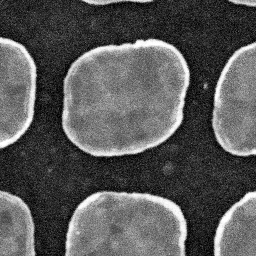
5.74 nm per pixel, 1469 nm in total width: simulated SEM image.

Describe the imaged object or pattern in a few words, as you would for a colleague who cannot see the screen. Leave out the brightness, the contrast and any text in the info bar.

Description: raised bodies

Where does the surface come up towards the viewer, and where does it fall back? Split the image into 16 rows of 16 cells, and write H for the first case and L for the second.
LLLLLLLLLLLLLLLL
LLLLLLLLLLLLLLLL
LLLLLLLLLHLLLLLL
HHLLLHHHHHHLLLLH
HHLLHHHHHHHHLLHH
HHLLHHHHHHHHLLHH
HHLLHHHHHHHLLHHH
HHLLHHHHHHHLLHHH
HLLLHHHHHHLLLLHH
LLLLLLHHHLLLLLHH
LLLLLLLLLLLLLLLL
LLLLLLLLLLLLLLLL
HLLLLHHHHHLLLLLH
HHLLLHHHHHHLLLHH
HHLLHHHHHHHHLLHH
HHLLHHHHHHHHLHHH